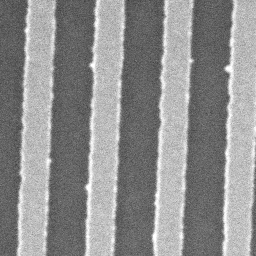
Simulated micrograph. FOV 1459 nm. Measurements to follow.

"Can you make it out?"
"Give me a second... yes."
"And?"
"lines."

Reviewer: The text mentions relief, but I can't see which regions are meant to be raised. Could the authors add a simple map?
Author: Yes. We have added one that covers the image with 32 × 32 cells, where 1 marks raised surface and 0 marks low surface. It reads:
00001110000011100000011100000111
00001110000011100000011100000111
00011110000011100000011100000111
00011110000011100000011100000111
00011110000011100000011100000111
00011110000011100000011100000111
00011110000011100000011100000111
00011110000011100000111100000111
00011110000011100000111100000111
00011100000011100000111100000111
00011100000011100000111100000111
00011100000011100000111000000111
00011100000011100000111000000111
00011100000011100000111000000111
00011100000111100000111000000111
00011100000111100000111000001111
00011100000111100000111000000111
00011100000111100000111000000111
00011100000111100000111000001111
00011100000111100000111000001111
00011100000111100000111000001111
00011100000111100000111000001111
00011100000111100000111000001111
00011100000111000000111000001111
00011100000111000000111000001111
00111100000111000000111000001110
00111100000111000000111000001110
00111100000111000000111000001110
00111100000111000001111000001110
00111100000111000001111000001110
00111100000111000001111000001110
00111100000111000001111000001110